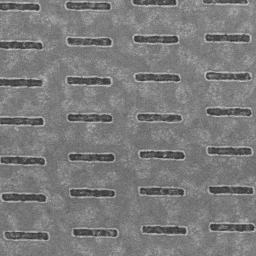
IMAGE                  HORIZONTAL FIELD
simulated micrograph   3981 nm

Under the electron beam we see a regular array of holes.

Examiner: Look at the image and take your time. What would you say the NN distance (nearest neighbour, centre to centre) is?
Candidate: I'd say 579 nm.